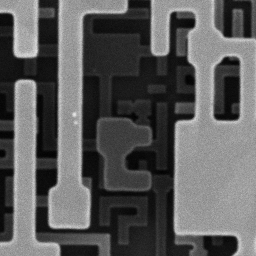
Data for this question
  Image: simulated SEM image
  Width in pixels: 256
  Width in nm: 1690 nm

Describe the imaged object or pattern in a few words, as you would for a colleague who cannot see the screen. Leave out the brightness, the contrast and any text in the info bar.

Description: wiring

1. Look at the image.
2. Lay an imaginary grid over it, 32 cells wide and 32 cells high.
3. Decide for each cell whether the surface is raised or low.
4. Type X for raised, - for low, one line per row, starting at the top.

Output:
XXXXX--XXXXXXXXX---XXXXXXXX-----
XXXXX--XXXXXXXXX---XXX--XXX-----
--XXX--XXX---------XX----XX-----
--XXX--XXX---------XX---XXX-----
--XXX--XXX---------XX---XXXX----
--XXX--XXX---------XX---XXXXXXXX
--XXX--XXX---------XX---XXXXXXXX
-------XXX--------------XXXX--XX
-------XXX--------------XXX---XX
-------XXX---------------XX---XX
--XX---XXX---------------XX---XX
--XX---XXX---------------XX---XX
--XX---XXX---------------XX---XX
--XX---XXX--------------XXX---XX
--XX---XXX--------------XXX---XX
--XX---XXX--XXXXX-----XXXXXXXXXX
--XX---XXX--XXXXXXX---XXXXXXXXXX
--XX---XXX--XXXXXXX---XXXXXXXXXX
--XX---XXX--XXXXX-----XXXXXXXXXX
--XX---XXX---XXX------XXXXXXXXXX
--XX---XXX---XXX------XXXXXXXXXX
--XX---XXX---XXXXX----XXXXXXXXXX
--XX---XXX---XXXXXX---XXXXXXXXXX
--XX---XXXX--XXXXXX---XXXXXXXXXX
--XX--XXXXX-----------XXXXXXXXXX
--XX--XXXXX-----------XXXXXXXXXX
--XX--XXXXX-----------XXXXXXXXXX
--XX--XXXXX-----------XXXXXXXXXX
--XX-----XX-----------XXXXXXXXXX
--XX-------------------------XXX
XXXXXXX-----------------------XX
XXXXXXX-----------------------XX